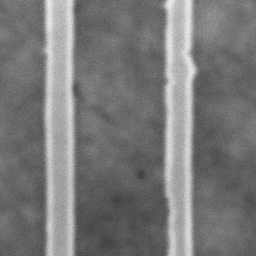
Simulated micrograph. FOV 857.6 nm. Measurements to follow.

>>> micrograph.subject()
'one or a few lines or trenches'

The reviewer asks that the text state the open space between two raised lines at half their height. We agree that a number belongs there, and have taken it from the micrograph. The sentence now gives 99.6 px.